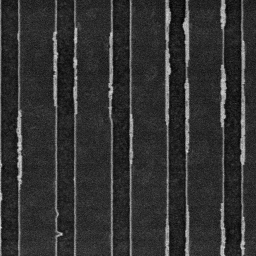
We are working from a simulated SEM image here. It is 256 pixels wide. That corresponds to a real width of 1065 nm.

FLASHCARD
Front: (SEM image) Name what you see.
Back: parallel lines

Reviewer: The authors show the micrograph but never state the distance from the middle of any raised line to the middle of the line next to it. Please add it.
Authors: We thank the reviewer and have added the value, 232 nanometers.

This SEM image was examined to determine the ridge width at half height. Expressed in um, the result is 0.16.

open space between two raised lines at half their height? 72.5 nanometers